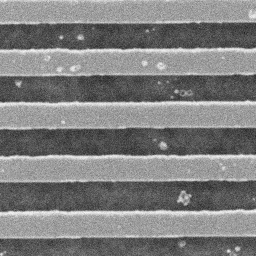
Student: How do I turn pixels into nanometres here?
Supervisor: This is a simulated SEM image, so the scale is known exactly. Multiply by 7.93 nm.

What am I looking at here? lines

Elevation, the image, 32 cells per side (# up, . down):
################################
################################
################################
................................
................................
................................
################################
################################
################################
................................
................................
................................
................................
################################
################################
################################
................................
................................
................................
......###....###...###.#########
################################
################################
##########################.####.
................................
................................
................................
.##.####.#######################
################################
################################
#######################.........
................................
................................